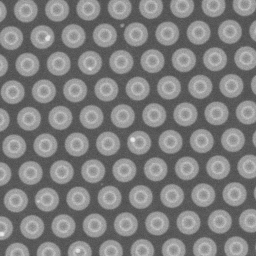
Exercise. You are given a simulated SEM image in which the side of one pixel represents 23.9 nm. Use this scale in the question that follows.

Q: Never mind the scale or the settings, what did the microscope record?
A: an array of small figures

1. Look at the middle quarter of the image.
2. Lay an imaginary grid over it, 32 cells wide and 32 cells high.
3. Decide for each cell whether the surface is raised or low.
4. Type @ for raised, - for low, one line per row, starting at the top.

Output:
@---@@@@@---@@@@@--@@@@@@--@@@@@
@---@@@@@---@@@@----@@@@----@@@@
------@@------------------------
-----------------@@------@@@----
-@@@@---@@@@@---@@@@@---@@@@@--@
@@@@@---@@@@@---@@@@@--@@@@@@--@
@@@@@@--@@@@@---@@@@@--@@@@@@--@
@@@@@@--@@@@@---@@@@@---@@@@@---
@@@@@----@@@@----@@@-----@@@----
--------------------------------
------@@-----@@@-----@@@----@@@@
@----@@@@---@@@@@---@@@@@---@@@@
@@--@@@@@@--@@@@@---@@@@@---@@@@
@@--@@@@@@--@@@@@@--@@@@@---@@@@
@@--@@@@@---@@@@@---@@@@@---@@@@
@----@@@@----@@@-----@@@--------
--------------------------------
--@@@----@@@@----@@@@---@@@@@---
-@@@@@--@@@@@@--@@@@@---@@@@@---
@@@@@@--@@@@@@--@@@@@@--@@@@@---
@@@@@@--@@@@@@--@@@@@@--@@@@@---
-@@@@@---@@@@@---@@@@----@@@@---
-@@@@-----@@------@@------------
-----------------------------@@@
@-----@@@----@@@@----@@@@---@@@@
@@---@@@@@--@@@@@@--@@@@@@--@@@@
@@--@@@@@@--@@@@@@--@@@@@@--@@@@
@@--@@@@@@--@@@@@@--@@@@@@--@@@@
@@---@@@@@---@@@@----@@@@----@@@
@-----@@------------------------
------------------@@------@@----
--@@@@---@@@@@---@@@@@---@@@@---